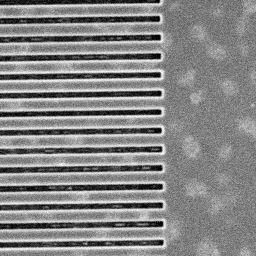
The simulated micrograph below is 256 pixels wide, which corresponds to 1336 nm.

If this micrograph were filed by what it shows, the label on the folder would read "parallel lines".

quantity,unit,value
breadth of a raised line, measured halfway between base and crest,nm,64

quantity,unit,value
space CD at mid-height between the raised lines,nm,32.6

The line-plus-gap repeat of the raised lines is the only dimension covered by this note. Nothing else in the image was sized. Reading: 97.4 nm